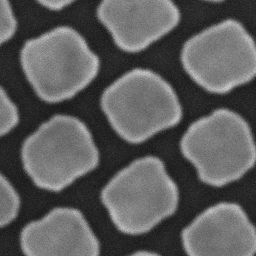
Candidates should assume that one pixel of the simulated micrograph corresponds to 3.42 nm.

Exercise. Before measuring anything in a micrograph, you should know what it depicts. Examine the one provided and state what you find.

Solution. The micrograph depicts raised bodies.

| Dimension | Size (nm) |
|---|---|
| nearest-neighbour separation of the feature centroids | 306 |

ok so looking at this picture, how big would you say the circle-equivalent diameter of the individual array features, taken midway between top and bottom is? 243 nm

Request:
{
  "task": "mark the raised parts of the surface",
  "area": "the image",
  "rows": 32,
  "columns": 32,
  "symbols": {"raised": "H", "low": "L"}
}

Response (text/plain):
HLLLLLHHLLLLLHHHHHHHHHLLLLLLLLLL
HLLLLLLLLLLLHHHHHHHHHHLLLLLLLLLL
HHLLLLLLLLLLLHHHHHHHHHLLLLLLLLLL
HHLLLLLHLLLLLHHHHHHHHLLLLLHHHHLL
HLLLLHHHHHLLLLHHHHHHLLLLLHHHHHHL
LLLHHHHHHHHLLLLHHHLLLLLHHHHHHHHH
LLLHHHHHHHHLLLLLLLLLLLLHHHHHHHHH
LLLHHHHHHHHHLLLLLLLLLLLHHHHHHHHH
LLLHHHHHHHHHLLLLLLLLLLLHHHHHHHHH
LLLHHHHHHHHHLLLLHHHHLLLLHHHHHHHH
LLLLHHHHHHHLLLHHHHHHHLLLLHHHHHLL
HLLLLHHHHLLLLHHHHHHHHHLLLLLLLLLL
HLLLLLHLLLLLLHHHHHHHHHLLLLLLLLLL
HHLLLLLLLLLLLHHHHHHHHHHLLLLLLLLL
HHLLLLLHLLLLLLHHHHHHHHHLLLHHHHLL
HHLLLLHHHHLLLLHHHHHHHHLLHHHHHHHL
HLLLLHHHHHHLLLLHHHHHLLLHHHHHHHHL
LLLHHHHHHHHLLLLLHHLLLLLHHHHHHHHH
LLLHHHHHHHHHLLLLLLLLLLLHHHHHHHHH
LLLHHHHHHHHHLLLLLLLLLLLHHHHHHHHH
LLLHHHHHHHHHLLLLLHHHLLLLHHHHHHHH
LLLHHHHHHHHLLLLHHHHHHLLLLHHHHHHL
HLLLHHHHHLLLLLHHHHHHHLLLLHHHHLLL
HLLLLLHHLLLLLHHHHHHHHHLLLLLLLLLL
HHLLLLLLLLLLLHHHHHHHHHLLLLLLLLLL
HHLLLLLLLLLLLHHHHHHHHHLLLLLLLLLL
HHLLLLHHHHLLLLHHHHHHHHLLLLHHHHLL
HLLLLHHHHHHLLLHHHHHHLLLLHHHHHHHL
LLLHHHHHHHHLLLLHHHHLLLLHHHHHHHHH
LLLHHHHHHHHHLLLLLLLLLLLHHHHHHHHH
LLLHHHHHHHHHLLLLLLLLLLLHHHHHHHHH
LLLHHHHHHHHHLLLLLLLLLLLHHHHHHHHH